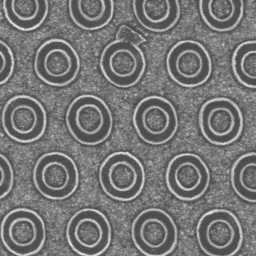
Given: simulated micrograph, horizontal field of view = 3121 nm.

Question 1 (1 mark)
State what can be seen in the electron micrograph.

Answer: a regular array of ring-shaped raised bodies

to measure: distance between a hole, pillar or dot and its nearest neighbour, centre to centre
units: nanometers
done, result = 790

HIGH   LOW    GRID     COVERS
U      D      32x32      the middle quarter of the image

DUUUDDDDDUUUDDDDDDUUDDDDDDUUDDDD
DUUDDDDDDDUUDDDDDUUUDDDDDDUUUDDD
UUUDDDDDDDUUUDDDUUUDDDDDDDUUUDDD
UUDDDDDDDDDUUUUUUUUDDDDDDDDUUUUU
UDDDDDDDDDDDUUUUUUDDDDDDDDDDUUUU
DDDDDDDDDDDDDDDDDDDDDDDDDDDDDDDD
DDDDDDDDDDDDDDDDDDDDDDDDDDDDDDDD
DDDDDDDDDDDDDDDDDDDDDDDDDDDDDDDD
DDDUUUUUDDDDDDDDDDDDDUUUDDDDDDDD
DDUUUUUUUUDDDDDDDDDUUUUUUUDDDDDD
DDUUUDDUUUDDDDDDDDDUUUUUUUUDDDDD
DUUUDDDDDUUDDDDDDDUUUDDDUUUDDDDD
DUUDDDDDDUUDDDDDDDUUDDDDDUUUDDDD
DUUDDDDDDUUUDDDDDUUUDDDDDDUUDDDD
DUUDDDDDDUUUDDDDDUUUDDDDDDUUDDDD
DUUUDDDDDUUUDDDDDDUUDDDDDDUUDDDD
DDUUUDDDUUUUDDDDDDUUUDDDDUUUDDDD
DDUUUUUUUUUDDDDDDDDUUUUUUUUDDDDD
DDDUUUUUUUDDDDDDDDDDUUUUUUDDDDDD
DDDDUUUUUDDDDDDDDDDDDUUUUDDDDDDD
DDDDDDDDDDDDDDDDDDDDDDDDDDDDDDDD
DDDDDDDDDDDDDDDDDDDDDDDDDDDDDDDD
DDDDDDDDDDDDUUUUDDDDDDDDDDDDDDDD
UDDDDDDDDDDUUUUUUUDDDDDDDDDDUUUU
UUDDDDDDDDUUUUUUUUUDDDDDDDDUUUUU
UUUDDDDDDDUUUDDDUUUUDDDDDDUUUDDD
UUUDDDDDDUUUDDDDDUUUDDDDDDUUDDDD
DUUDDDDDDUUUDDDDDDUUDDDDDDUUDDDD
DUUDDDDDDUUUDDDDDDUUDDDDDDUUDDDD
DUUDDDDDDUUUDDDDDUUUDDDDDDUUUDDD
UUUDDDDDDDUUUDDDDUUUDDDDDDUUUDDD
UUDDDDDDDDUUUUUUUUUDDDDDDDDUUUUU